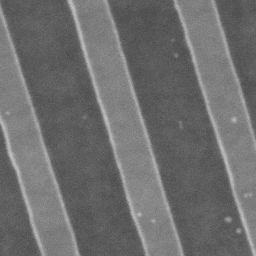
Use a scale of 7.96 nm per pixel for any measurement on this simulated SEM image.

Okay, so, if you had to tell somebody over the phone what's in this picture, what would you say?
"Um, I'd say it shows lines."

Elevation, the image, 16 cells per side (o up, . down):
....ooo....oo...
.....oo....ooo..
o....oo.....oo..
o....ooo....oo..
o.....oo....ooo.
oo....oo.....oo.
oo....ooo....oo.
oo.....oo....ooo
ooo....oo.....oo
.oo....oo.....oo
.oo....ooo....oo
.ooo....oo....oo
..oo....oo.....o
..oo....ooo....o
..ooo....oo....o
...oo....oo.....